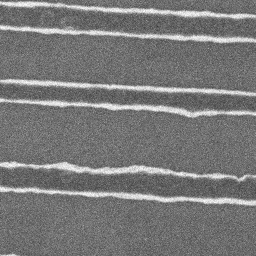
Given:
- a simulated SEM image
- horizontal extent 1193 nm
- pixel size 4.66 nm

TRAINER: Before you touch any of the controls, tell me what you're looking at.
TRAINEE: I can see one or a few lines or trenches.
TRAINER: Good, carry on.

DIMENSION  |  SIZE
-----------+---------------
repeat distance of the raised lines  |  0.374 microns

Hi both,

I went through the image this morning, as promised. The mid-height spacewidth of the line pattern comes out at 55.5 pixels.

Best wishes